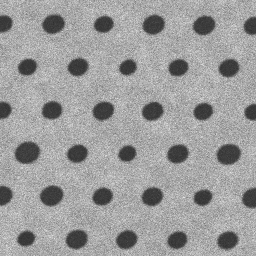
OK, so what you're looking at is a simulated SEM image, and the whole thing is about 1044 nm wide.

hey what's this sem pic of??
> a regular array of holes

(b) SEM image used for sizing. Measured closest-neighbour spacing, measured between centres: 49.4 px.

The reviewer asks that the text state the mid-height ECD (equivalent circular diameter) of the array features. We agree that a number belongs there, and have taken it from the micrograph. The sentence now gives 19.2 pixels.